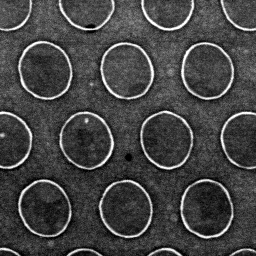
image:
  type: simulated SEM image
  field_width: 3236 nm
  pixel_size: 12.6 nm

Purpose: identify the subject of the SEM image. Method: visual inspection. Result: a regular array of raised bodies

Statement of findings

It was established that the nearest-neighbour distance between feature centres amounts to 1000 nm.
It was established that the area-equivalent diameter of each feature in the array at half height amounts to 679 nm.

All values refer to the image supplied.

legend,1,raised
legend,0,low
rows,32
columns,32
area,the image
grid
11110000111111000011111100001111
11110000111111000011111100001111
11100000011110000001111000000111
11000000001100000000110000000011
00000000000000000000000000000000
00001100000000010000000001000000
00011111000001111100000111110000
00011111100001111110000111111000
00111111100001111110000111111000
00011111100001111110000111111000
00011111100001111110000111111000
00001111000000111100000011110000
00000000000000000000000000000000
00000000000000000000000000000000
11000000011100000001110000000111
11100000111110000011111000001111
11110000111111000011111100001111
11110000111111000011111100001111
11110000111111000011111100001111
11100000111111000011111000001111
11000000011110000001111000000111
00000000000000000000000000000000
00000000000000000000000000000000
00011111000000111100000011110000
00011111000001111100000111110000
00111111100001111110000111111000
00011111100001111110000111111000
00011111100001111110000111111000
00001111000000111100000011110000
00000110000000011000000001100000
00000000000000000000000000000000
11000000011100000001110000000011